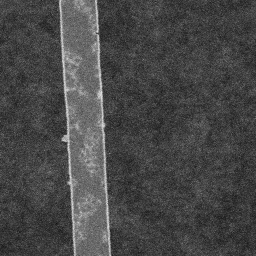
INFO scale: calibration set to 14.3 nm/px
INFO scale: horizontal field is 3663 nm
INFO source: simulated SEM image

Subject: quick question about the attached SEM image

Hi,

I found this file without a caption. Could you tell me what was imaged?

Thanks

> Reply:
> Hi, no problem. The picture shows one or a few lines or trenches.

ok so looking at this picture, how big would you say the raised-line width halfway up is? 0.509 microns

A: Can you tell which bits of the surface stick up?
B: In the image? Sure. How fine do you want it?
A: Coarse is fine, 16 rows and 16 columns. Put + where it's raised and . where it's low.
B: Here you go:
....++..........
....++..........
....++..........
....++..........
....++..........
....++..........
....++..........
....++..........
....++..........
....+++.........
....+++.........
....+++.........
....+++.........
.....++.........
.....++.........
.....++.........